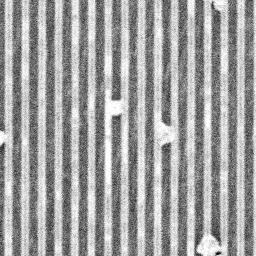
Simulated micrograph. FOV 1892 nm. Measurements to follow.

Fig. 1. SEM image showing parallel lines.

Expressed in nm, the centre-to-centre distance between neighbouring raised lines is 123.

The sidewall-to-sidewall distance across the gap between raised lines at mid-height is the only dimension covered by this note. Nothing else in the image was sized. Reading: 82.3 nanometres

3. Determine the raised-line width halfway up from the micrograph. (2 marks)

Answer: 0.0444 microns